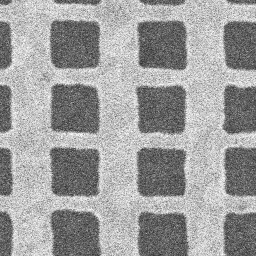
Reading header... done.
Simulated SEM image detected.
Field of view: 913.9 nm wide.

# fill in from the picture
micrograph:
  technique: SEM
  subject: holes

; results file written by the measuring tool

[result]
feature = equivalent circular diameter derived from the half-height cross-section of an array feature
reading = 196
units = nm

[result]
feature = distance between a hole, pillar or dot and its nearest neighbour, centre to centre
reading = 225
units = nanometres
